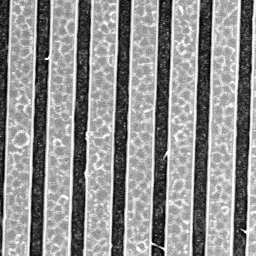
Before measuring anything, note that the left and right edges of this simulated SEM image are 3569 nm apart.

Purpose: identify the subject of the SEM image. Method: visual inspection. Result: parallel lines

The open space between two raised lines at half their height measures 197 nm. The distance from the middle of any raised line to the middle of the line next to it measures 0.565 micrometres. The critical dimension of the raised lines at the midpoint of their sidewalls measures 0.366 microns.